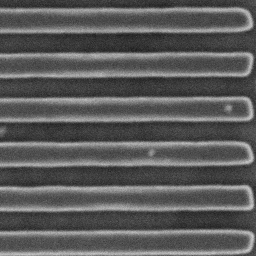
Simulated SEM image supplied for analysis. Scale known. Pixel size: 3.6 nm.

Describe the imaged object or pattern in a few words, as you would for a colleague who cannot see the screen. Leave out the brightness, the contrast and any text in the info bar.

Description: wiring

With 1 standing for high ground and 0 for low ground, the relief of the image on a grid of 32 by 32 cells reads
00000000000000000000000000000000
11111111111111111111111111111110
11111111111111111111111111111110
11111111111111111111111111111110
00000000000000000000000000000000
00000000000000000000000000000000
00000000000000000000000000000000
11111111111111111111111111111110
11111111111111111111111111111110
11111111111111111100110000000000
00000000000000000000000000000000
00000000000000000000000000000000
11111111111111111111111111111110
11111111111111111111111111111110
11111111111111111111111111111110
00000000000000000000000000000000
00000000000000000000000000000000
00000000000000000000000000000000
11111111111111111111111111111110
11111111111111111111111111111111
11111111111111111111111111111110
00000000000000000000000000000000
00000000000000000000000000000000
11111111111111111111111111111110
11111111111111111111111111111110
11111111111111111111111111111111
00000000000000000000000000000000
00000000000000000000000000000000
00000000000000000000000000000000
11111111111111111111111111111111
11111111111111111111111111111111
11111111111111111111111111111110